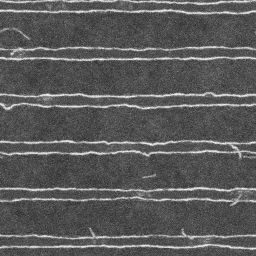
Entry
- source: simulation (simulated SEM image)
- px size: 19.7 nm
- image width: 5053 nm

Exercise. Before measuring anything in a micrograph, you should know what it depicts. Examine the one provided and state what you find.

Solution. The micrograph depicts parallel lines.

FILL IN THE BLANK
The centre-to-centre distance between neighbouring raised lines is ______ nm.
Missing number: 926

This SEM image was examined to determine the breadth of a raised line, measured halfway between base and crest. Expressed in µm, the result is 0.212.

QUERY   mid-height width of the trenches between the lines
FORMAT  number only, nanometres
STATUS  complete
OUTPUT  725